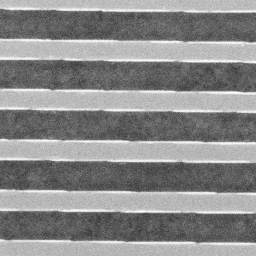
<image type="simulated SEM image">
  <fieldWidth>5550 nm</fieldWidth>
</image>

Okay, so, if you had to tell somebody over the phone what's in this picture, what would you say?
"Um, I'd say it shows lines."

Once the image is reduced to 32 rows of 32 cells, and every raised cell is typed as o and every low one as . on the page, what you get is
oooooooooooooooooooooooooooooooo
................................
................................
................................
................................
oooooooooooooooooooooooooooooooo
oooooooooooooooooooooooooooooooo
.............ooooooooooooooooooo
................................
................................
................................
oooooooooooooooooooooo..........
oooooooooooooooooooooooooooooooo
oooooooooooooooooooooooooooooooo
................................
................................
................................
................................
oooooooooooooooooooooooooooooooo
oooooooooooooooooooooooooooooooo
................................
................................
................................
................................
oooooooooooooooooooooooooooooooo
oooooooooooooooooooooooooooooooo
........................oooooooo
................................
................................
................................
oooooooooooooooooooooooooooooooo
oooooooooooooooooooooooooooooooo